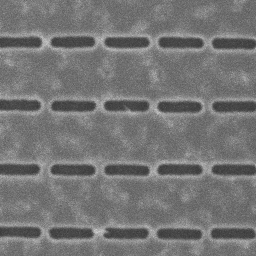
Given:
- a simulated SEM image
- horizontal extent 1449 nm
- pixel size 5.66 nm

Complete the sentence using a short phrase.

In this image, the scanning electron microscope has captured a regular array of holes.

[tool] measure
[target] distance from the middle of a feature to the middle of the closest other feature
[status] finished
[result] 0.303 micrometres